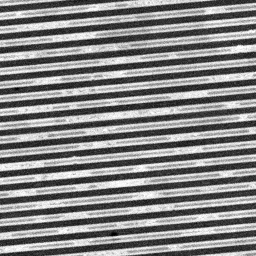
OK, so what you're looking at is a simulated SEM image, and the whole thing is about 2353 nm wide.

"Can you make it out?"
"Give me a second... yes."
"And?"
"parallel lines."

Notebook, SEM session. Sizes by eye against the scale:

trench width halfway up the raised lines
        82.4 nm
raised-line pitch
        126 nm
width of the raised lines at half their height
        0.0492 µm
